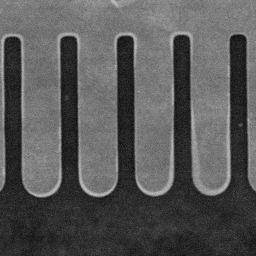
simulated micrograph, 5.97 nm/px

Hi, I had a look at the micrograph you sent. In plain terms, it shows groups of lines, slits or small figures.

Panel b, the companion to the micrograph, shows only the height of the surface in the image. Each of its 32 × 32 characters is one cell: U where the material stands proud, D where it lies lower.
UUUUUUUUUUUUUUUUUUUUUUUUUUUUUUUU
UUUUUUUUUUUUUUUUUUUUUUUUUUUUUUUU
UUUUUUUUUUUUUUUUUUUUUUUUUUUUUUUU
UUUUUUUUUUUUUUUUUUUUUUUUUUUUUUUU
UDUUUUUUDUUUUUUDDUUUUUDDUUUUUDDU
DDDUUUUDDDUUUUDDDUUUUDDDUUUUUDDU
DDDUUUUDDDUUUUUDDUUUUUDDUUUUUDDU
DDDUUUUDDDUUUUUDDUUUUUDDUUUUUDDU
DDDUUUUDDDUUUUUDDUUUUUDDUUUUUDDU
DDDUUUUDDDUUUUUDDUUUUUDDUUUUUDDU
DDDUUUUDDDUUUUUDDUUUUUDDUUUUUDDU
DDDUUUUUDDUUUUUDDUUUUUDDUUUUUDDU
DDDUUUUUDDUUUUUDDUUUUUDDUUUUUDDU
DDDUUUUUDDUUUUUDDUUUUUDDUUUUUDDU
DDDUUUUUDDUUUUUDDUUUUUDDUUUUUDDU
DDDUUUUUDDUUUUUDDUUUUUDDUUUUUDDU
DDDUUUUUDDUUUUUDDUUUUUDDUUUUUDDU
UDDUUUUUDDUUUUUDDUUUUUDDUUUUUDDU
UDDUUUUUDDUUUUUDDUUUUUDDUUUUUDDU
UDDUUUUUDDUUUUUDDUUUUDDDDUUUUDDU
UDDUUUUUDDUUUUUDDUUUUDDDDUUUUDDU
UDDUUUUUDDUUUUUDDUUUUDDDDUUUUDDU
UDDUUUUDDDUUUUUDDUUUUDDDDUUUUDDU
DDDUUUUDDDDUUUDDDDUUUDDDDUUUDDDD
DDDDDDDDDDDDDDDDDDDDDDDDDDDDDDDD
DDDDDDDDDDDDDDDDDDDDDDDDDDDDDDDD
DDDDDDDDDDDDDDDDDDDDDDDDDDDDDDDD
DDDDDDDDDDDDDDDDDDDDDDDDDDDDDDDD
DDDDDDDDDDDDDDDDDDDDDDDDDDDDDDDD
DDDDDDDDDDDDDDDDDDDDDDDDDDDDDDDD
DDDDDDDDDDDDDDDDDDDDDDDDDDDDDDDD
DDDDDDDDDDDDDDDDDDDDDDDDDDDDDDDD